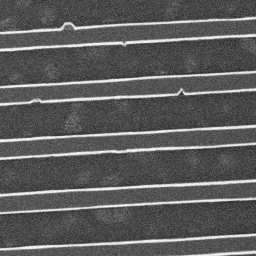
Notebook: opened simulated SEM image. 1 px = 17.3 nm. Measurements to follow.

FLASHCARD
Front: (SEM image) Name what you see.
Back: parallel lines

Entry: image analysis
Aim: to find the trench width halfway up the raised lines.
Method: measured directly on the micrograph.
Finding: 621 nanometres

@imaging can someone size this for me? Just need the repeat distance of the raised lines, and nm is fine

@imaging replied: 936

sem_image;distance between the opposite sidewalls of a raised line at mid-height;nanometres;310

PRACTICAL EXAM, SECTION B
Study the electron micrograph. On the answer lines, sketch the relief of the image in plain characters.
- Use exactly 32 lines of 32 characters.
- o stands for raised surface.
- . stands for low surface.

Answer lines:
................................
................................
............................oooo
........oooooooooooooooooooooooo
ooooooooooooooooooooooooooooooo.
ooooooooooo.....................
................................
................................
................................
.......................ooooooooo
........oooooooooooooooooooooooo
oooooooooooooooooooooooooo.o....
ooooooooo.......................
................................
................................
................................
...................ooooooooooooo
.ooooooooooooooooooooooooooooooo
oooooooooooooooooooooooo........
oooo............................
................................
................................
................................
...............ooooooooooooooooo
oooooooooooooooooooooooooooooooo
ooooooooooooooooo...............
oo..............................
................................
................................
.............................ooo
............oooooooooooooooooooo
oooooooooooooooooooooooooooooooo